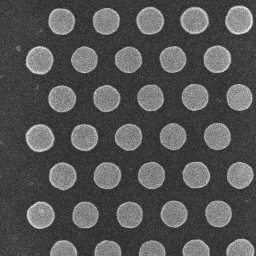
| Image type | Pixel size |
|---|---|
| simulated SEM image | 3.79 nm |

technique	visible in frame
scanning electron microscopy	a regular array of raised bodies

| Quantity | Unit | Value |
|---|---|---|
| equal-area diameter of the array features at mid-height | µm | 0.1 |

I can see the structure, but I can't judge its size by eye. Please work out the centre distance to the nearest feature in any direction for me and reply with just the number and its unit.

167 nm